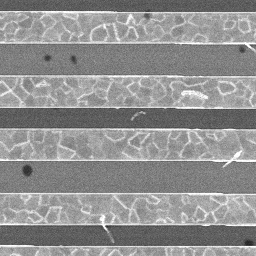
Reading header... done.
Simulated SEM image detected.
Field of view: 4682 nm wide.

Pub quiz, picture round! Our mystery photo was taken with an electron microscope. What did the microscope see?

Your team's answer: lines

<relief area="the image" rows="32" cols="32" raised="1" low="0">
00000000000000000000000000000000
11111111111111100000000000000000
11111111111111111111111111111111
11111111111111111111111111111111
11111111111111111111111111111111
00000000000000000000000000000011
00000000000000000000000000000000
00000000000000000000000000000000
00000000000000000000000000000000
00000000000000000000000000000000
11111111111111111111111111111111
11111111111111111111111111111111
11111111111111111111111111111111
00000000000000000000000000000000
00000000000000000000000000000000
00000000000000000000000000000000
11111111111111111111111111111111
11111111111111111111111111111111
11111111111111111111111111111111
11111111111111111111111111111111
00000000000000000000000000000000
00000000000000000000000000000000
00000000000000000000000000000000
00000000000000000000000000000000
11111111111111111111111111111111
11111111111111111111111111111111
11111111111111111111111111111111
11111111111111111111111111111111
00000000000000000000000000000000
00000000000000000000000000000000
00000000000000000000000000000000
11111111111111111111111111111111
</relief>